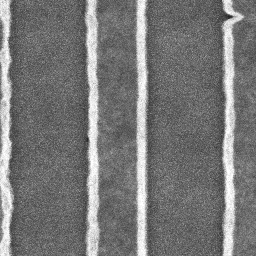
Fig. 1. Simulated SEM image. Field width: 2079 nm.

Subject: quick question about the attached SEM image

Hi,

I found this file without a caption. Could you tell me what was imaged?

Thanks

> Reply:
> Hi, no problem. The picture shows one or a few lines or trenches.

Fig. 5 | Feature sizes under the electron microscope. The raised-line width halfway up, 401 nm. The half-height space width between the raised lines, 702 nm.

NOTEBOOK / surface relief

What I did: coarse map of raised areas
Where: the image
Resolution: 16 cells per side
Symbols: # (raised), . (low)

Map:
......###.....##
......###.....##
......###.....##
......###.....##
......###.....##
......###.....##
......###.....##
......###.....##
......###.....##
......###.....##
......###.....##
......###.....##
#.....###.....##
......###.....##
......###.....##
......###.....##